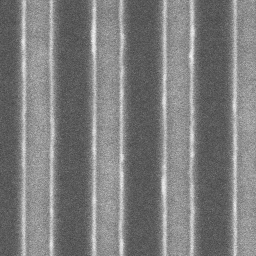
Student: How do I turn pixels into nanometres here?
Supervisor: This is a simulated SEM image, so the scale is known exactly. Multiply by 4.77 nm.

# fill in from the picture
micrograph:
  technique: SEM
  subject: one or a few lines or trenches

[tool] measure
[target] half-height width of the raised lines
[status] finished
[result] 0.215 microns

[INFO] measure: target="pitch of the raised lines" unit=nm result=334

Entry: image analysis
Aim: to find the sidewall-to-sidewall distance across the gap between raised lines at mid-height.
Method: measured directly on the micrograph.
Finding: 0.122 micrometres